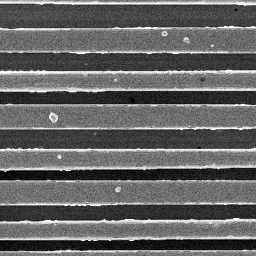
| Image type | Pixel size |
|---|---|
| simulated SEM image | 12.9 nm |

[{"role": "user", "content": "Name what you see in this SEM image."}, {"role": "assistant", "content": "lines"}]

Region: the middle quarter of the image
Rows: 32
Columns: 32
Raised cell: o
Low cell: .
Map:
................................
................................
oooooooooooooooooooooooooooooooo
oooooooooooooooooooooooooooooooo
oooooooooooooooooooooooooooooooo
oooooooooooooooooooooooooooooooo
oooooooooooooooooooooooooooooooo
................................
................................
................................
oooooooooooooooooooooooooooooooo
oooooooooooooooooooooooooooooooo
oooooooooooooooooooooooooooooooo
oooooooooooooooooooooooooooooooo
oooooooooooooooooooooooooooooooo
oooooooooooooooooooooooooooooooo
................................
................................
................................
................................
................................
oooooooooooooooooooooooooooooooo
oooooooooooooooooooooooooooooooo
oooooooooooooooooooooooooooooooo
oooooooooooooooooooooooooooooooo
oooooooooooooooooooooooooooooooo
................................
................................
................................
oooooooooooooooooooooooooooooooo
oooooooooooooooooooooooooooooooo
oooooooooooooooooooooooooooooooo